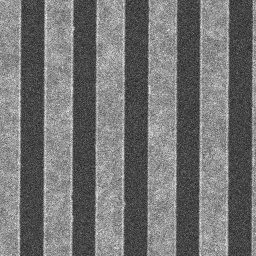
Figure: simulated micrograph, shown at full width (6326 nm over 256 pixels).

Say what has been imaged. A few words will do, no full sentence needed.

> parallel lines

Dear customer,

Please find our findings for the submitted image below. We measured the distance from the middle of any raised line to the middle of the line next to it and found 1280 nm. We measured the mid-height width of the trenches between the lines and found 627 nm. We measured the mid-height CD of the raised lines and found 670 nanometers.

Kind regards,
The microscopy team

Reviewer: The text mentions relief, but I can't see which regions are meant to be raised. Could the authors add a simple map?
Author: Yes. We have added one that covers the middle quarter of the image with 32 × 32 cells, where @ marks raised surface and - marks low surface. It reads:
@@-------@@@@@@------@@@@@@@----
@@-------@@@@@@------@@@@@@@----
@@-------@@@@@@------@@@@@@@----
@@-------@@@@@@------@@@@@@@----
@@-------@@@@@@------@@@@@@@----
@@-------@@@@@@------@@@@@@@----
@@-------@@@@@@------@@@@@@@----
@@-------@@@@@@------@@@@@@@----
@@------@@@@@@@------@@@@@@@----
@@------@@@@@@@------@@@@@@@----
@@------@@@@@@@------@@@@@@@----
@@------@@@@@@@------@@@@@@@----
@@------@@@@@@@------@@@@@@@----
@@------@@@@@@@------@@@@@@@----
@@------@@@@@@@------@@@@@@@----
@@------@@@@@@@------@@@@@@@----
@@------@@@@@@@------@@@@@@@----
@@------@@@@@@@------@@@@@@@----
@@------@@@@@@@------@@@@@@@----
@@------@@@@@@@------@@@@@@@----
@@------@@@@@@@------@@@@@@@----
@@------@@@@@@@------@@@@@@@----
@@------@@@@@@@------@@@@@@@----
@@------@@@@@@@------@@@@@@@----
@@------@@@@@@@------@@@@@@@----
@@------@@@@@@@------@@@@@@@----
@@------@@@@@@@------@@@@@@@----
@@------@@@@@@@------@@@@@@@----
@@------@@@@@@@------@@@@@@@----
@@------@@@@@@@------@@@@@@@----
@@------@@@@@@@------@@@@@@@----
@@------@@@@@@@------@@@@@@@----